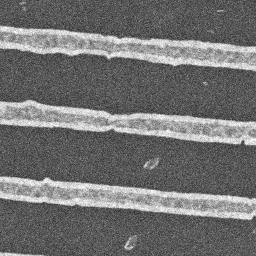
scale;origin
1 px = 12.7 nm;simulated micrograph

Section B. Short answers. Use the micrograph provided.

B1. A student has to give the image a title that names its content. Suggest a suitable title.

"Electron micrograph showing one or a few lines or trenches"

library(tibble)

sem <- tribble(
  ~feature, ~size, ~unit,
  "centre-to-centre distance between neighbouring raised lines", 950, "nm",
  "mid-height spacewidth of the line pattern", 727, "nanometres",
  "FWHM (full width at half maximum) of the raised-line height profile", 218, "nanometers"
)